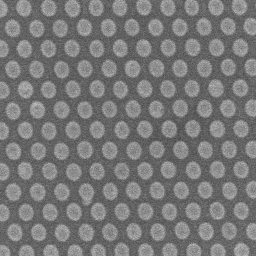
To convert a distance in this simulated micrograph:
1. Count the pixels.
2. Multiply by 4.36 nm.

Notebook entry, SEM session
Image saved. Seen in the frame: a regular array of raised bodies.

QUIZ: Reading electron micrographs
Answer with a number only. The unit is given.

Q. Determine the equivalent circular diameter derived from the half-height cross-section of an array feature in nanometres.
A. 67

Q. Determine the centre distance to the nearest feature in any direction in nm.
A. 101